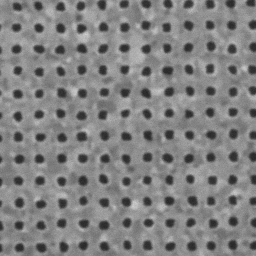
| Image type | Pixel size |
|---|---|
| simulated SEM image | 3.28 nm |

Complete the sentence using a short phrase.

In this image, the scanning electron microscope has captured a regular array of holes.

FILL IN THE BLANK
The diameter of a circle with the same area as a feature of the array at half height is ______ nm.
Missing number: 34.3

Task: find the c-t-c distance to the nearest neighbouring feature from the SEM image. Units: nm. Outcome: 68